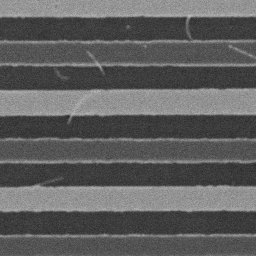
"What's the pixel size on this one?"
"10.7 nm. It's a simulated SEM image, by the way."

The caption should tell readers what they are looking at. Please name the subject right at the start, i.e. lines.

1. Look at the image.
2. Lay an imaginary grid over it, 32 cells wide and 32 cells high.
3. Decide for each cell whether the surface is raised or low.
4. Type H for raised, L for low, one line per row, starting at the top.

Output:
HHHHHHHHHHHHHHHHHHHHHHHHHHHHHHHH
HHHHHHHHHHHHHHHHHHHHHHHHHHHHHHHH
LLLLLLLLLLLLLLLLLLLLLLLLLLLLLLLL
LLLLLLLLLLLLLLLLLLLLLLLLLLLLLLLL
LLLLLLLLLLLLLLLLLLLLLLLLLLLLLLLL
HHHHHHHHHHHHHHHHHHHHHHHHHHHHHHHH
HHHHHHHHHHHHHHHHHHHHHHHHHHHHHHHH
HHHHHHHHHHHHHHHHHHHHHHHHHHHHHHHH
LLLLLLLLLLLLLLLLLLLLLLLLLLLLLLLL
LLLLLLLLLLLLLLLLLLLLLLLLLLLLLLLL
LLLLLLLLLLLLLLLLLLLLLLLLLLLLLLLL
HHHHHHHHHHHHHHHHHHHHHHHHHHHHHHHH
HHHHHHHHHHHHHHHHHHHHHHHHHHHHHHHH
HHHHHHHHHHHHHHHHHHHHHHHHHHHHHHHH
LLLLLLLLLLLLLLLLLLLLLLLLLLLLLLLL
LLLLLLLLLLLLLLLLLLLLLLLLLLLLLLLL
LLLLLLLLLLLLLLLLLLLLLLLLLLLLLLLL
HHHHHHHHHHHHHHHHHHHHHHHHHHHHHHHH
HHHHHHHHHHHHHHHHHHHHHHHHHHHHHHHH
HHHHHHHHHHHHHHHHHHHHHHHHHHHHHHHH
LLLLLLLLLLLLLLLLLLLLLLLLLLLLLLLL
LLLLLLLLLLLLLLLLLLLLLLLLLLLLLLLL
LLLLLLLLLLLLLLLLLLLLLLLLLLLLLLLL
HHHHHHHHHHHHHHHHHHHHHHHHHHHHHHHH
HHHHHHHHHHHHHHHHHHHHHHHHHHHHHHHH
HHHHHHHHHHHHHHHHHHHHHHHHHHHHHHHH
LLLLLLLLLLLLLLLLLLLLLLLLLLLLLLLL
LLLLLLLLLLLLLLLLLLLLLLLLLLLLLLLL
LLLLLLLLLLLLLLLLLLLLLLLLLLLLLLLL
HHHHHHHHHHHHHHHHHHHHHHHHHHHHHHHH
HHHHHHHHHHHHHHHHHHHHHHHHHHHHHHHH
HHHHHHHHHHHHHHHHHHHHHHHHHHHHHHHH